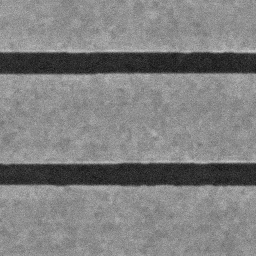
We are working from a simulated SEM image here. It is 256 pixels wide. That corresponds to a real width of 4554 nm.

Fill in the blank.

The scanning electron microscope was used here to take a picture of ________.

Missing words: lines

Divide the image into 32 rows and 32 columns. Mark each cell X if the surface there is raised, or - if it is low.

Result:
XXXXXXXXXXXXXXXXXXXXXXXXXXXXXXXX
XXXXXXXXXXXXXXXXXXXXXXXXXXXXXXXX
XXXXXXXXXXXXXXXXXXXXXXXXXXXXXXXX
XXXXXXXXXXXXXXXXXXXXXXXXXXXXXXXX
XXXXXXXXXXXXXXXXXXXXXXXXXXXXXXXX
XXXXXXXXXXXXXXXXXXXXXXXXXXXXXXXX
----------------------XX--XX-XXX
--------------------------------
--------------------------------
XXXXXXXXXXXXXXXXXXXXXXXXXXXXXXXX
XXXXXXXXXXXXXXXXXXXXXXXXXXXXXXXX
XXXXXXXXXXXXXXXXXXXXXXXXXXXXXXXX
XXXXXXXXXXXXXXXXXXXXXXXXXXXXXXXX
XXXXXXXXXXXXXXXXXXXXXXXXXXXXXXXX
XXXXXXXXXXXXXXXXXXXXXXXXXXXXXXXX
XXXXXXXXXXXXXXXXXXXXXXXXXXXXXXXX
XXXXXXXXXXXXXXXXXXXXXXXXXXXXXXXX
XXXXXXXXXXXXXXXXXXXXXXXXXXXXXXXX
XXXXXXXXXXXXXXXXXXXXXXXXXXXXXXXX
XXXXXXXXXXXXXXXXXXXXXXXXXXXXXXXX
--------------------------------
--------------------------------
--------------------------------
XXXXXXXXXXXXXXXXXXXXXXXXXXXXXXXX
XXXXXXXXXXXXXXXXXXXXXXXXXXXXXXXX
XXXXXXXXXXXXXXXXXXXXXXXXXXXXXXXX
XXXXXXXXXXXXXXXXXXXXXXXXXXXXXXXX
XXXXXXXXXXXXXXXXXXXXXXXXXXXXXXXX
XXXXXXXXXXXXXXXXXXXXXXXXXXXXXXXX
XXXXXXXXXXXXXXXXXXXXXXXXXXXXXXXX
XXXXXXXXXXXXXXXXXXXXXXXXXXXXXXXX
XXXXXXXXXXXXXXXXXXXXXXXXXXXXXXXX